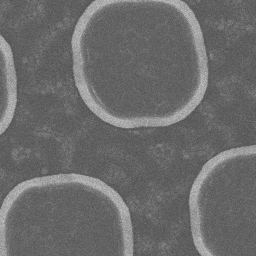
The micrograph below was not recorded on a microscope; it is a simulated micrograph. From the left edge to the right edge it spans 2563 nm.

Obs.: raised bodies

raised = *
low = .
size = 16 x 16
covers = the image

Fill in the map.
......*****.....
.....*******....
.....*******....
*....********...
*....********...
*....********...
*.....******....
.......****.....
................
...............*
.............***
..****......****
.******.....****
********....****
********....****
********.....***